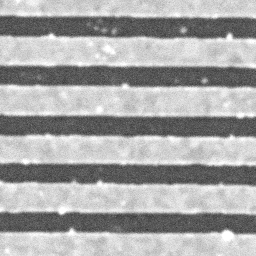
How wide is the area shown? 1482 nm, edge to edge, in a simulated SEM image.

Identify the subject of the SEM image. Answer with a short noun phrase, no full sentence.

lines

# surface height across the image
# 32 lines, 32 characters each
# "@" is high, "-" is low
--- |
@@@@@@@@@@@@@@@@@@@@@@@@@@@@@@@@
@@@@@@@@@@@@@@@@@@@@@@@@@@@@@@@@
--------------------------------
--------------------------------
--------------------------------
@@@@@@@@@@@@@@@@@@@@@@@@@@@@@@@@
@@@@@@@@@@@@@@@@@@@@@@@@@@@@@@@@
@@@@@@@@@@@@@@@@@@@@@@@@@@@@@@@@
--------------------------------
--------------------------------
--------------------------------
@@@@@@@@@@@@@@@@@@@@@@@@@@@@@@@@
@@@@@@@@@@@@@@@@@@@@@@@@@@@@@@@@
@@@@@@@@@@@@@@@@@@@@@@@@@@@@@@@@
-----------------------------@@@
--------------------------------
--------------------------------
@@@@@@@@@@@@@@@@@@@@@@@@@@@@@@@@
@@@@@@@@@@@@@@@@@@@@@@@@@@@@@@@@
@@@@@@@@@@@@@@@@@@@@@@@@@@@@@@@@
--------------------------@@@@-@
--------------------------------
--------------------------------
@@@@@@@@@@@@@@@@@@@@@@@@@@@@@@@@
@@@@@@@@@@@@@@@@@@@@@@@@@@@@@@@@
@@@@@@@@@@@@@@@@@@@@@@@@@@@@@@@@
-------@--------------@@@--@@@@@
--------------------------------
--------------------------------
@@@@@@@@@@@@@@@@@@@@@@@@@@@@@@@@
@@@@@@@@@@@@@@@@@@@@@@@@@@@@@@@@
@@@@@@@@@@@@@@@@@@@@@@@@@@@@@@@@